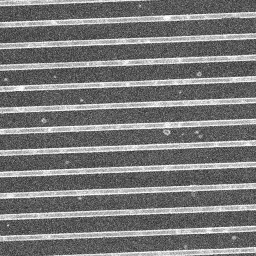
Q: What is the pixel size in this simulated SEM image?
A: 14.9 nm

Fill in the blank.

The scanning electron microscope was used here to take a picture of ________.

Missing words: parallel lines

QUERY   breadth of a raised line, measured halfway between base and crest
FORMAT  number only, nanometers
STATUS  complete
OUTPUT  68.9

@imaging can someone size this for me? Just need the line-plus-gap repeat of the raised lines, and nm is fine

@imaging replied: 319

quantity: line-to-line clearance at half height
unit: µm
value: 0.246